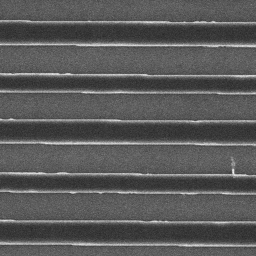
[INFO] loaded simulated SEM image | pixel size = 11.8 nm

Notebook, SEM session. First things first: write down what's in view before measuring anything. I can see lines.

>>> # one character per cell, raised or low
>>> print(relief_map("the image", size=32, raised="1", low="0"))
00000000000000000000000000000000
00000000000000000000000000000000
00000000000000000000000000000000
11111111111111111111111111111111
11111111111111111111111111111111
11111111111111111111111111111111
00000000000000000000000000000000
00000000000000000000000000000000
00000000000000000000000000000000
11111111111111111111111111111111
11111111111111111111111111111111
00000000001111111111111111111111
00000000000000000000000000000000
00000000000000000000000000000000
00000000000000000000000000000000
11111111111111111111111111111111
11111111111111111111111111111111
11111111111111111111111111111111
00000000000000000000000000000000
00000000000000000000000000000000
00000000000000000000000000000000
00000000000000000000000000000000
11111111111111111111111111111111
11111111111111111111111111111111
00000000000000000000000000000000
00000000000000000000000000000000
00000000000000000000000000000000
00000000000000000000000000000000
11111111111111111111111111111111
11111111111111111111111111111111
00000000001111111111111111111111
00000000000000000000000000000000